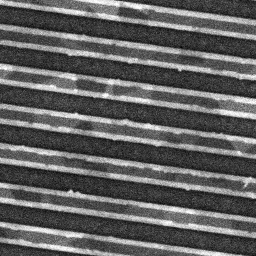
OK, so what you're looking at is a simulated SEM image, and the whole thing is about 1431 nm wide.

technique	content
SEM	parallel lines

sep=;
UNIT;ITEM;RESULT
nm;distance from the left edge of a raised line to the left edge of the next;219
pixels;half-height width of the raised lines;16.6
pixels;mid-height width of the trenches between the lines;22.4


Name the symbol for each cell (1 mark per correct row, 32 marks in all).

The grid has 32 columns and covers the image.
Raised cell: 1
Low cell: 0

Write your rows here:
01111111111111110000000000000000
00000000111111111111110000000000
00000000000000011111111111111100
10000000000000000000001111111111
11111111100000000000000000000011
01111111111111110000000000000000
00000000111111111111111010000000
00000000000000011111111111111110
11000000000000000000001111111111
11111111100000000000000000000011
00111111111111110000000000000000
00000000011111111111111000000000
00000000000000001111111111111110
11100000000000000000000011111111
11111111110000000000000000000001
00111111111111111000000000000000
00000000011111111111111100000000
00000000000000000111111111111110
11100000000000000000000011111111
11111111110000000000000000000001
00111111111111111000000000000000
00000000001111111111111100000000
00000000000000000111111111111111
11100000000000000000000111111111
11111111111100000000000000000001
00011111111111111100000000000000
00000000000111111111111110000000
00000000000000000011111111111111
11111000000000000000000001111111
11111111111000000000000000000000
00001111111111111110000000000000
00000000000111111111111110000000